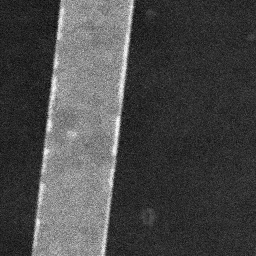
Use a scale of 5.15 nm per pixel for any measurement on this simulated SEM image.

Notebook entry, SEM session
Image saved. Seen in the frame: one or a few lines or trenches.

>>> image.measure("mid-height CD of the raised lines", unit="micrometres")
0.367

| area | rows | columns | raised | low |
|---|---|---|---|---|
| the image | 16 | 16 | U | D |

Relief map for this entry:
DDDDUUUUDDDDDDDD
DDDDUUUUDDDDDDDD
DDDDUUUUDDDDDDDD
DDDUUUUUDDDDDDDD
DDDUUUUUDDDDDDDD
DDDUUUUUDDDDDDDD
DDDUUUUUDDDDDDDD
DDDUUUUDDDDDDDDD
DDDUUUUDDDDDDDDD
DDDUUUUDDDDDDDDD
DDDUUUUDDDDDDDDD
DDDUUUUDDDDDDDDD
DDUUUUUDDDDDDDDD
DDUUUUUDDDDDDDDD
DDUUUUUDDDDDDDDD
DDUUUUUDDDDDDDDD